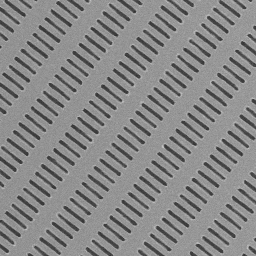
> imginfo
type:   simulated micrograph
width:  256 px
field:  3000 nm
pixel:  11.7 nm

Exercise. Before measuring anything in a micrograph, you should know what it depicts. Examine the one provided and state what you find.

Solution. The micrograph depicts a regular array of holes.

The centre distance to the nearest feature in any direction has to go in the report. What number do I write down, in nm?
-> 114